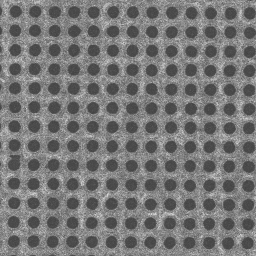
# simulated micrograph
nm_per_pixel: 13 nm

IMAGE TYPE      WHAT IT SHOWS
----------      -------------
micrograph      a regular array of holes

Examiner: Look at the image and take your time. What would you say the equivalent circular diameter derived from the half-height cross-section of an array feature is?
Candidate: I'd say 158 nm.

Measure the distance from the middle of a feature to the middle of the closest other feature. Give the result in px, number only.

19